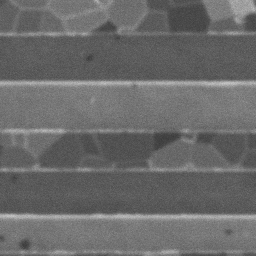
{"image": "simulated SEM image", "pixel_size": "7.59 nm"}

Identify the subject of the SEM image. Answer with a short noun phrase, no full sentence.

lines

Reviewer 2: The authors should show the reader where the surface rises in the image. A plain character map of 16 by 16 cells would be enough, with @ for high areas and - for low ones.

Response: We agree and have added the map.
@@@@@@@@@@@@@@@@
@@@@@@@@@@@@@@@@
----------------
----------------
----------------
@@@@@@@@@@@@@@@@
@@@@@@@@@@@@@@@@
@@@@@@@@@@@@@@@@
@@@@@@@@@@@@@@@@
@@@@@@@@@@@@@@@@
@@@@@@@@@@@@@@@@
----------------
----------------
@@@@@@@@@@@@@@@@
@@@@@@@@@@@@@@@@
@@@@@@@@@@@@@@@@